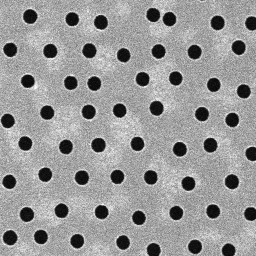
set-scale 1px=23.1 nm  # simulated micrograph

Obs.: a regular array of holes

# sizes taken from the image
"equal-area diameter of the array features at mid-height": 336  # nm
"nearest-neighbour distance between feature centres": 0.74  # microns